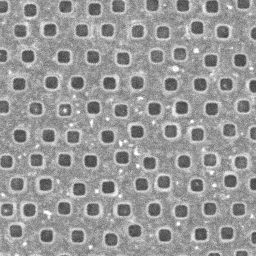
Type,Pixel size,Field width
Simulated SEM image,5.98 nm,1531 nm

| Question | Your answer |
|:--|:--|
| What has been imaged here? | a regular array of holes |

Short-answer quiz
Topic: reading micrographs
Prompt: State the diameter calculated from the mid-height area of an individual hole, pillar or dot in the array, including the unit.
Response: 0.0858 µm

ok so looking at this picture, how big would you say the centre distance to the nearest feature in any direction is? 0.156 µm